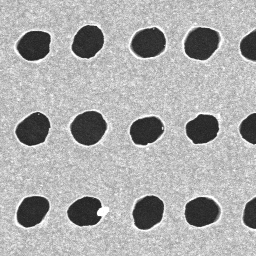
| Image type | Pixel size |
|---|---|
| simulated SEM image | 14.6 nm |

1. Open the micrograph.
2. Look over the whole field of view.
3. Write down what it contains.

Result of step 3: a regular array of holes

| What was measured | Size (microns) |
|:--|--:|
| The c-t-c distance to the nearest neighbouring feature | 0.783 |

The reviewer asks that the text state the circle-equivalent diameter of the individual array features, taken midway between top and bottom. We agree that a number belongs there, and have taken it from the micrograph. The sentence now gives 474 nanometres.